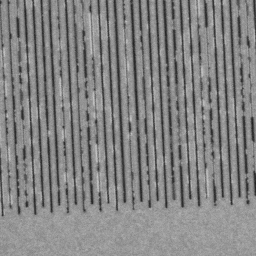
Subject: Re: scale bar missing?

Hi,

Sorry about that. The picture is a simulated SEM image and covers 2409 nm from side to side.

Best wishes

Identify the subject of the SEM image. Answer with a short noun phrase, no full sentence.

parallel lines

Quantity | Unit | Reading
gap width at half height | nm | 16.4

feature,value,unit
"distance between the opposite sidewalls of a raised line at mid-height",55.2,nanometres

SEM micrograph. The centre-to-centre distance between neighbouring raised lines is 77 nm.